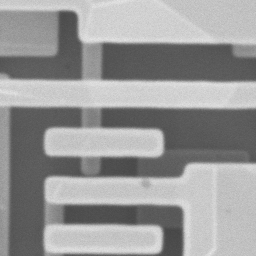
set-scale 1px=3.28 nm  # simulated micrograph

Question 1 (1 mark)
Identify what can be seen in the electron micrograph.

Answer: wiring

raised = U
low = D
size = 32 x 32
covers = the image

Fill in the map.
UUUUUUUUUUUUUUUUUUUUUUUUUUUUUUUU
DDDDDDDDDUUUUUUUUUUUUUUUUUUUUUUU
DDDDDDDDDDUUUUUUUUUUUUUUUUUUUUUU
DDDDDDDDDDUUUUUUUUUUUUUUUUUUUUUU
DDDDDDDDDDUUUUUUUUUUUUUUUUUUUUUU
DDDDDDDDDDDDDDDDDDDDDDDDDDDDDDDD
DDDDDDDDDDDDDDDDDDDDDDDDDDDDDDDD
DDDDDDDDDDDDDDDDDDDDDDDDDDDDDDDD
DDDDDDDDDDDDDDDDDDDDDDDDDDDDDDDD
DDDDDDDDDDDDDDDDDDDDDDDDDDDDDDDD
UUUUUUUUUUUUUUUUUUUUUUUUUUUUUUUU
UUUUUUUUUUUUUUUUUUUUUUUUUUUUUUUU
UUUUUUUUUUUUUUUUUUUUUUUUUUUUUUUU
DDDDDDDDDDDDDDDDDDDDDDDDDDDDUUDD
DDDDDDDDDDDDDDDDDDDDDDDDDDDDDDDD
DDDDDDDDDDDDDDDDDDDDDDDDDDDDDDDD
DDDDDDUUUUUUUUUUUUUUDDDDDDDDDDDD
DDDDDDUUUUUUUUUUUUUUDDDDDDDDDDDD
DDDDDDUUUUUUUUUUUUUUDDDDDDDDDDDD
DDDDDDDDDDDDDDUDDUUUDDDDDDDDDDDD
DDDDDDDDDDDDDDDDDDDDDDDDDDDDDDDD
DDDDDDDDDDDDDDDDDDDDDDDUUUUUUUUU
DDDDDDUUUUUUUUUUUUUUUUUUUUUUUUUU
DDDDDDUUUUUUUUUUUUUUUUUUUUUUUUUU
DDDDDDUUUUUUUUUUUUUUUUUUUUUUUUUU
DDDDDDDDDDDDDDDUUDDUUUUUUUUUUUUU
DDDDDDDDDDDDDDDDDDDDDDDUUUUUUUUU
DDDDDDDDDDDDDDDDDDDDDDDUUUUUUUUU
DDDDDDUUUUUUUUUUUUUUDDDUUUUUUUUU
DDDDDDUUUUUUUUUUUUUUDDDUUUUUUUUU
DDDDDDUUUUUUUUUUUUUUDDDUUUUUUUUU
DDDDDDUUUUUUUUUUUUUUDDDUUUUUUUUU